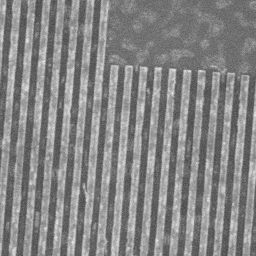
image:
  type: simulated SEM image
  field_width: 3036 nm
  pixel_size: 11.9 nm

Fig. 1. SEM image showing parallel lines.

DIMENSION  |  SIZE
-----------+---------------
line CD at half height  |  70.9 nm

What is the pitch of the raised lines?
173 nanometers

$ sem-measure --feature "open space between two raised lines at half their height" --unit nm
102